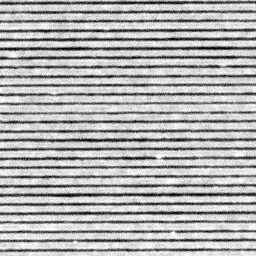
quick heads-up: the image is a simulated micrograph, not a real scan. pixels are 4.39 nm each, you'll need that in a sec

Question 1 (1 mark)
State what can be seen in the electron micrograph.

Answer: parallel lines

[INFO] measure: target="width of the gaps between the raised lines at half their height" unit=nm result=15.4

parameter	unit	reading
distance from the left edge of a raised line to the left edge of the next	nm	40.1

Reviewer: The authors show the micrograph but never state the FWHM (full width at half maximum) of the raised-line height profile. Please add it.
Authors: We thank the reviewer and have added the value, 22.5 nm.